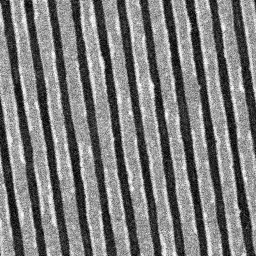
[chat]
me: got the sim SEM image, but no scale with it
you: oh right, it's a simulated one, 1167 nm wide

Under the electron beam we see parallel lines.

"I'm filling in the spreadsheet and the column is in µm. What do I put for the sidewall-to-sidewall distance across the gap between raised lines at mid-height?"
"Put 0.0423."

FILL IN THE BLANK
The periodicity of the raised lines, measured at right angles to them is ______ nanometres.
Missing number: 104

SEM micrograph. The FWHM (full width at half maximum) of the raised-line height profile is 63.1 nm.